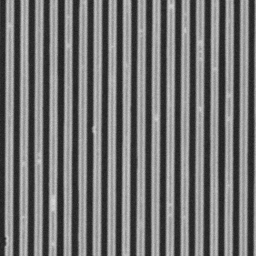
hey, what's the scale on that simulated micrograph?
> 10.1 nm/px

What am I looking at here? parallel lines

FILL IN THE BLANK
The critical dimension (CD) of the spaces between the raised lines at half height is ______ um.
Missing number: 0.0861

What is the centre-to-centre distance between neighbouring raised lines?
148 nm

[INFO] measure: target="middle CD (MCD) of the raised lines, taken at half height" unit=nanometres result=59.5